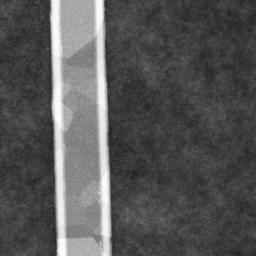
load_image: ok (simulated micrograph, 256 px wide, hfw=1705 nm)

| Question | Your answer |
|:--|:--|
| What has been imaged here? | one or a few lines or trenches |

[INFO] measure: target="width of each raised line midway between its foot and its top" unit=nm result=288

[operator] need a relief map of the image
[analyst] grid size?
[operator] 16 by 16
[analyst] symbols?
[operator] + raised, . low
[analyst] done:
...+++..........
....++..........
....++..........
....++..........
....++..........
....++..........
....++..........
....++..........
....++..........
....++..........
....++..........
....+++.........
....+++.........
....+++.........
....+++.........
....+++.........